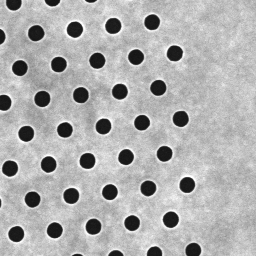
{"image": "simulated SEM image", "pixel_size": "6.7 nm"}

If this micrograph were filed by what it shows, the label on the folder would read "a regular array of holes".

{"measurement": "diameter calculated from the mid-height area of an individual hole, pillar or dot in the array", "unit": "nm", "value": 104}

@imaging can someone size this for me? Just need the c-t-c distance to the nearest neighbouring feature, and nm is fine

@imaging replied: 255